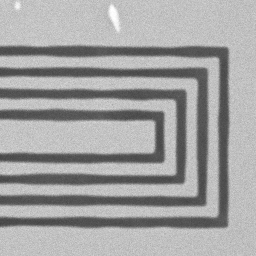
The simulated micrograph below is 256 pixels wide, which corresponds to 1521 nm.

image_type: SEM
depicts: groups of lines, slits or small figures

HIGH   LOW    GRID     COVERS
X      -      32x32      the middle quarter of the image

XXXXXXXXXXXXXXXXXXXXXXXXXXXXXXXX
--------------------------------
--------------------------------
XXX----XXXXXXXXXXXXX------------
XXXXXXXXXXXXXXXXXXXXXXXXXXXXXXXX
XXXXXXXXXXXXXXXXXXXXXXXXXXXXXXXX
------------------------------XX
-------------------------------X
-------------------------------X
XXXXXXXXXXXXXXXXXXXXXXXXXXXX---X
XXXXXXXXXXXXXXXXXXXXXXXXXXXX---X
----------------------XXXXXX---X
-------------------------XXX---X
-------------------------XXX---X
--XXXXXXXXXXXXXXXXXXXX---XXX---X
XXXXXXXXXXXXXXXXXXXXXXX--XXX---X
XXXXXXXXXXXXXXXXXXXXXXX--XXX---X
XXXXXXXXXXXXXXXXXXXXXXX--XXX---X
XXXXXXXXXXXXXXXXXXXXXXX--XXX---X
XXXXXXXXXXXXXXXXXXXXXXX--XXX---X
XXXXXXXXXXXXXXXXXXXXXXX--XXX---X
XXXXXXXXXXXXXXXXXXXXXXX--XXX---X
-------------------------XXX---X
-------------------------XXX---X
-------------------------XXX---X
XXXXXXXXXXXXXXXXXXXXXXXXXXXX---X
XXXXXXXXXXXXXXXXXXXXXXXXXXXX--XX
--------XXXXXXXXXXXXXXXXXXXX--XX
------------------------------XX
------------------------------XX
XXXXXXXXXXXXXXXXXXXXXXXXXXXXXXXX
XXXXXXXXXXXXXXXXXXXXXXXXXXXXXXXX